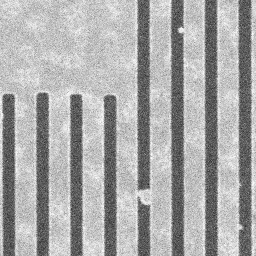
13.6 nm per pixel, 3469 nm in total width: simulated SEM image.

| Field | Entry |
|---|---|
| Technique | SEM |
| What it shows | parallel lines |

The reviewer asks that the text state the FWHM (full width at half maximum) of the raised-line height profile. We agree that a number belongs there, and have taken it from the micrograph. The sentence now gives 269 nm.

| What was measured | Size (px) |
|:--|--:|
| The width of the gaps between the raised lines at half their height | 13.6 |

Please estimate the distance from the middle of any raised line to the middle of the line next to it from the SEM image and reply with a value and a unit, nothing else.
458 nanometers